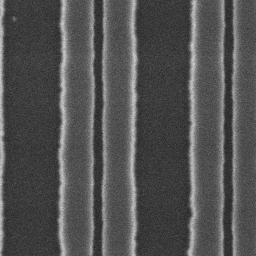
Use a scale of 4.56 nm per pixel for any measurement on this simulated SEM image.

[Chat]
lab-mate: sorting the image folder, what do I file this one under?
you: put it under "lines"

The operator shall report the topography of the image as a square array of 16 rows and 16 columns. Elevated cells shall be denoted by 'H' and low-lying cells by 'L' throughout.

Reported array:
LLLLHHHHLLLLHHHH
LLLLHHHHLLLLHHHH
LLLLHHHHLLLLHHHH
LLLLHHHHLLLLHHHH
LLLLHHHHLLLLHHHH
LLLLHHHHLLLLHHHH
LLLLHHHHLLLLHHHH
LLLLHHHHLLLLHHHH
LLLLHHHHLLLLHHHH
LLLLHHHHLLLLHHHH
LLLLHHHHLLLLHHHH
LLLLHHHHLLLLHHHH
LLLLHHHHLLLLHHHH
LLLLHHHHLLLLHHHH
LLLLHHHHLLLLHHHH
LLLLHHHHLLLLHHHH